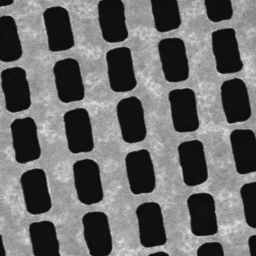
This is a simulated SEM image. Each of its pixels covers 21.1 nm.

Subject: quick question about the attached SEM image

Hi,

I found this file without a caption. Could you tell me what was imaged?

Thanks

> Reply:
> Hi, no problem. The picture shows a regular array of holes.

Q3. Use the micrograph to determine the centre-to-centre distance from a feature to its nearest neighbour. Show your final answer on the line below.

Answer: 1.09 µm